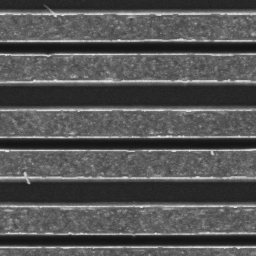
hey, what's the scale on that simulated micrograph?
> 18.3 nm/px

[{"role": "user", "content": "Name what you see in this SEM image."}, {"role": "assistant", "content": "parallel lines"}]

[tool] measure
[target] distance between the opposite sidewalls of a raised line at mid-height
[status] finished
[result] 592 nm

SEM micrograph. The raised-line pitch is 882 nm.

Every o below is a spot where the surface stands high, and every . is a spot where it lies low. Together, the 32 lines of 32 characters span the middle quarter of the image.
oooooooooooooooooooooooooooooooo
oooooooooooooooooooooooooooooooo
oooooooooooooooooooooooooooooooo
oooooooooooooooooooooooooooooooo
oooooooooooooooooooooooooooooooo
................................
................................
................................
................................
................................
................................
oooooooooooooooooooooooooooooooo
oooooooooooooooooooooooooooooooo
oooooooooooooooooooooooooooooooo
oooooooooooooooooooooooooooooooo
oooooooooooooooooooooooooooooooo
oooooooooooooooooooooooooooooooo
oooooooooooooooooooooooooooooooo
oooooooooooooooooooooooooooooooo
................................
................................
oooooooooooooooooooooooooooooooo
oooooooooooooooooooooooooooooooo
oooooooooooooooooooooooooooooooo
oooooooooooooooooooooooooooooooo
oooooooooooooooooooooooooooooooo
oooooooooooooooooooooooooooooooo
oooooooooooooooooooooooooooooooo
oooooooooooooooooooooooooooooooo
................................
................................
................................